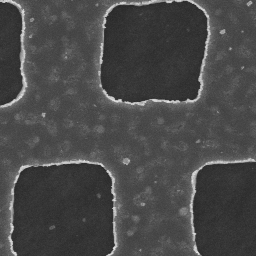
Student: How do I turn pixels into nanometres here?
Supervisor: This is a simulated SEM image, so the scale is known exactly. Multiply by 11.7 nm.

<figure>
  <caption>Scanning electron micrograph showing holes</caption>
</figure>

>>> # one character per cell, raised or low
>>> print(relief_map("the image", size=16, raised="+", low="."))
.++++++.....++++
.++++++......+++
.+++++.......+++
.+++++.......+++
.+++++.......+++
.+++++......++++
++++++++++++++++
++++++++++++++++
++++++++++++++++
++++++++++++++++
++....+++++++...
+......+++++....
+......+++++....
+......+++++....
+......+++++....
+......+++++....